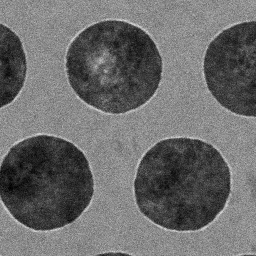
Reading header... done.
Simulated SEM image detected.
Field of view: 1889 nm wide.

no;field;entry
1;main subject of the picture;holes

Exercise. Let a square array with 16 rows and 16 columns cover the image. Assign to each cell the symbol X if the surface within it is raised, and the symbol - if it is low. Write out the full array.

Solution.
XXXXXXXXXXXXXXXX
XXXXXX--XXXXXXX-
-XXXX-----XXX---
--XX------XXX---
--XX------XXX---
-XXXX-----XXX---
XXXXX----XXXXX--
XXXXXXXXXXXXXXXX
XX-XXXXXXXXXXXXX
-----XXXX-----XX
------XXX-----XX
------XX------XX
------XX------XX
X----XXXX-----XX
XXXXXXXXXXXXXXXX
XXXXXXXXXXXXXXXX